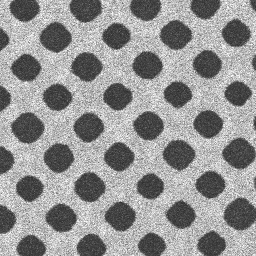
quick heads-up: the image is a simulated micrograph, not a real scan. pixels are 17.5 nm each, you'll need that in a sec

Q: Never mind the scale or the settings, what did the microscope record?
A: a regular array of holes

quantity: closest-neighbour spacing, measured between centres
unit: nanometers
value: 741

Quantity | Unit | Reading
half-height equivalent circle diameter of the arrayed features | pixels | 28.7